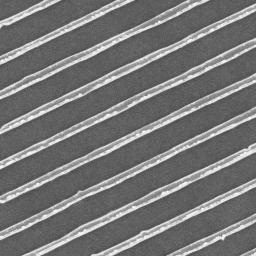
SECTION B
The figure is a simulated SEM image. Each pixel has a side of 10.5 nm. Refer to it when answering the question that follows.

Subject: parallel lines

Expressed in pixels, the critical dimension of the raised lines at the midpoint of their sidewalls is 6.75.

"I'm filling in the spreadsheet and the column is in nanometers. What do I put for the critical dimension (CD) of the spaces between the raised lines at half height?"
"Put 261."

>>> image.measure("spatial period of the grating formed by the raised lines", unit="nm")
331